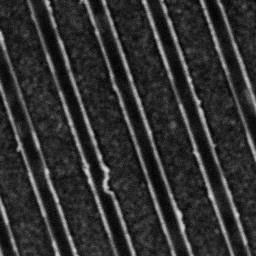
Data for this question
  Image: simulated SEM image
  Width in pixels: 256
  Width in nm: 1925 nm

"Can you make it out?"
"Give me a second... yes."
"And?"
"parallel lines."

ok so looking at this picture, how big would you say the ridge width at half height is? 143 nm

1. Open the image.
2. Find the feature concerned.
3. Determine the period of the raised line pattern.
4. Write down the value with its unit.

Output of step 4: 0.412 um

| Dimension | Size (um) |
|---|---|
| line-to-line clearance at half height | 0.265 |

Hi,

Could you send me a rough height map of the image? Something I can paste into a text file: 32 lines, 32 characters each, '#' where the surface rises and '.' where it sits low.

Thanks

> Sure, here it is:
....##.....##.....###....###....
....##.....###....###.....##....
....###....###.....##.....##....
.....##.....##.....###....###...
.....##.....###....###.....##...
#....###.....##.....##.....##...
#.....##.....##.....###....###..
#.....###....###....###.....##..
#.....###.....##.....##.....###.
##.....##.....##.....###....###.
##.....##.....###.....##.....##.
###....###.....##.....##.....##.
###.....##.....###....###....###
.##.....##.....###....###.....##
.###....###.....##.....###....##
..##.....##.....##.....###....##
..##.....###....###.....##.....#
..###....###.....##.....##.....#
..###.....##.....##.....###....#
...##.....###....###....###.....
...###....###.....##.....##.....
....##.....###....##.....###....
....##.....##.....###.....##....
....###....###.....##.....###...
....###.....##.....###....###...
.....##.....###....###.....##...
#....###.....##.....###....###..
#.....##.....##.....###....###..
#.....##.....###....###.....##..
##....###.....##.....##.....###.
##.....##.....##.....###....###.
##.....###....###....###.....##.